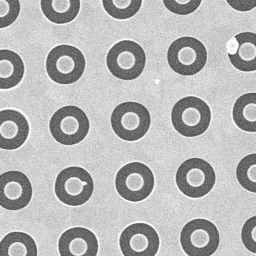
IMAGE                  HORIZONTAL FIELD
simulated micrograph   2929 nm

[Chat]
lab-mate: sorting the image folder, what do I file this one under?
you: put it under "an array of small figures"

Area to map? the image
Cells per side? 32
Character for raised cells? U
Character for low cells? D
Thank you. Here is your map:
DDDUUDDDDDUUUDDDDDUUDDDDDUUUDDDD
DDUUUDDDDDUUUDDDDUUUUDDDUUUUUUUU
DDUUUUDDDUUUUUUUUUUUUUUUUUUUUUUU
DUUUUUUUUUUUUUUUUUUUUUUUUUUUUUUU
UUUUUUUUUUUUUUUUUUUUUUUUUUUUUUDD
UUUUUUUUUUUUUUDDDUUUUDDDDUUUUUDD
DDUUUUDDDDUUUDDDDDUUUDDDDDUUUDDD
DDDUUUDDDDDUUDDDDDUUUDDDDDUUUDDD
DDDUUUDDDDDUUDDDDDUUUDDDDUUUUDDD
DDDUUUDDDDUUUUDDDUUUUUUUUUUUUUUU
DDUUUUUDDUUUUUUUUUUUUUUUUUUUUUUU
UUUUUUUUUUUUUUUUUUUUUUUUUUUUUUUU
UUUUUUUUUUUUUUUUUUUUUUDDDUUUUUDD
UUUUUUUUDDUUUUDDDDUUUUDDDDUUUDDD
DDDUUUDDDDDUUUDDDDDUUDDDDDUUUDDD
DDDDUUDDDDDUUUDDDDDUUUDDDDUUUDDD
DDDDUUDDDDDUUUDDDDUUUUDDDDUUUUUD
DDDUUUUDDDUUUUUDDUUUUUUUUUUUUUUU
DDUUUUUUUUUUUUUUUUUUUUUUUUUUUUUU
UUUUUUUUUUUUUUUUUUUUUUUUUUUUUUUD
UUUUUUUUUUUUUUUUDDUUUUUDDDUUUUDD
UDDUUUUDDDDUUUUDDDDUUUDDDDDUUDDD
DDDDUUUDDDDDUUDDDDDUUUDDDDDUUUDD
DDDDUUUDDDDDUUDDDDDUUUDDDDDUUUDD
DDDDUUUDDDDUUUUDDDDUUUUDDUUUUUUU
DDDDUUUUDDUUUUUUUUUUUUUUUUUUUUUU
UUUUUUUUUUUUUUUUUUUUUUUUUUUUUUUU
UUUUUUUUUUUUUUUUUUUUUUUUDDUUUUUD
UUUUUUUUUDDUUUUUDDDUUUUDDDDUUUDD
UDDDUUUUDDDDUUUDDDDDUUDDDDDUUUDD
DDDDDUUDDDDDUUUDDDDDUUUDDDDUUUDD
DDDDDUUDDDDDUUUDDDDDUUUDDDDUUUUD